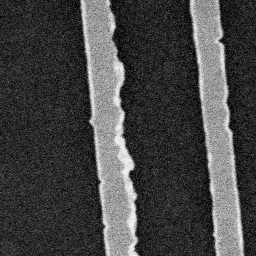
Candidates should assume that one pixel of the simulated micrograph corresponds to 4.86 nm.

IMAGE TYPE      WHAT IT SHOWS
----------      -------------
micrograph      one or a few lines or trenches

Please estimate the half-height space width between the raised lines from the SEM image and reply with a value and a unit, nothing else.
394 nm